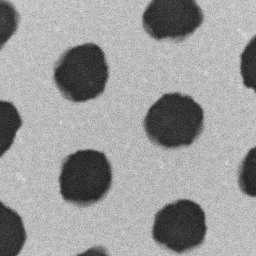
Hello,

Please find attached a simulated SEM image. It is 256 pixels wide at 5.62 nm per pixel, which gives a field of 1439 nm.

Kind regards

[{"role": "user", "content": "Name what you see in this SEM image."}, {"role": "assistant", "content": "holes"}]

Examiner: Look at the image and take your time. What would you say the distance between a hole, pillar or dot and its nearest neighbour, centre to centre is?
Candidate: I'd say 583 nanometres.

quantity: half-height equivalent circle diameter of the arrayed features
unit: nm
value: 304